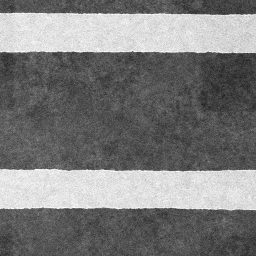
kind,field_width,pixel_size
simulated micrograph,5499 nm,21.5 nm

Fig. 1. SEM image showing one or a few lines or trenches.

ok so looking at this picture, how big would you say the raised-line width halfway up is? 0.813 um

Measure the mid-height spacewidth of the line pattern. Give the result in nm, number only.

2550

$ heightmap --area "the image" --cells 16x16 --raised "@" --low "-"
----------------
@@@@@@@@@@@@@@@@
@@@@@@@@@@@@@@@@
----------------
----------------
----------------
----------------
----------------
----------------
----------------
----------------
@@@@@@@@@@@@@@@@
@@@@@@@@@@@@@@@@
----------------
----------------
----------------